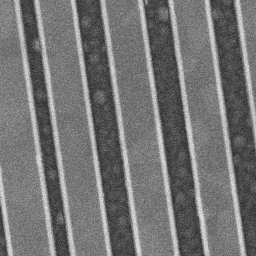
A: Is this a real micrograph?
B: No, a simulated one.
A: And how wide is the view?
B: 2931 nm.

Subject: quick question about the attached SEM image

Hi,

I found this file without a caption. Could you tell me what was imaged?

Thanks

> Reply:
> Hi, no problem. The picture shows one or a few lines or trenches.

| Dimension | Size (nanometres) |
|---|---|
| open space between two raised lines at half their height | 342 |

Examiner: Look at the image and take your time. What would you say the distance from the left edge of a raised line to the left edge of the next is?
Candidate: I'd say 750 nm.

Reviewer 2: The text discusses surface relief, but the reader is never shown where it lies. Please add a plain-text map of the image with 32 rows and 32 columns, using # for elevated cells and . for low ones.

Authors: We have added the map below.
##...####....#####...#####....##
##...####....#####....####....##
##...#####...#####....####....##
###..#####...#####....####....##
###..#####...#####....####....##
###..#####....####....#####...##
###...####....####....#####....#
###...####....#####...#####....#
###...####....#####....####....#
###...#####...#####....####....#
####..#####...#####....####....#
####..#####...#####....####....#
####..#####....####....#####...#
####...####....####....#####....
####...####....#####...#####....
####...####....#####...#####....
####...#####...#####....####....
#####..#####...#####....####....
#####..#####...#####....####....
#####..#####....####....#####...
#####...####....####....#####...
#####...####....#####...#####...
#####...####....#####....####...
#####...#####...#####....####...
######..#####...#####....####...
######..#####...#####....####...
.#####..#####....####....#####..
.#####...####....####....#####..
.#####...####....#####...#####..
.#####...####....#####....####..
.#####...#####...#####....####..
.######..#####...#####....####..